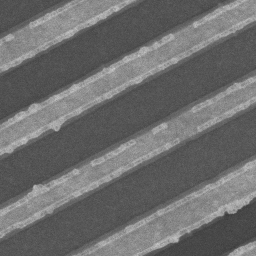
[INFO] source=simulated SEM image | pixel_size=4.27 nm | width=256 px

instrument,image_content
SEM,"one or a few lines or trenches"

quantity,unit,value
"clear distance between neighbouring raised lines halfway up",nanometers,195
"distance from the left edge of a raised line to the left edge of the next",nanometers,323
